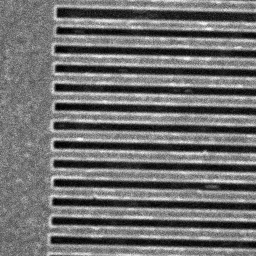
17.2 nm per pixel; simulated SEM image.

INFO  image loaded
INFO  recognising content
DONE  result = parallel lines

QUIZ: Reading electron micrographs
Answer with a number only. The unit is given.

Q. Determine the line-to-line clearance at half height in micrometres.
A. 0.148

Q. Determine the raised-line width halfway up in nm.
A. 178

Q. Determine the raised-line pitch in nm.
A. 326